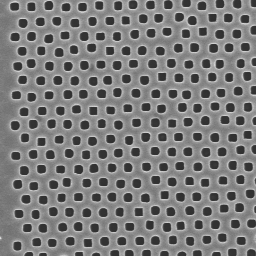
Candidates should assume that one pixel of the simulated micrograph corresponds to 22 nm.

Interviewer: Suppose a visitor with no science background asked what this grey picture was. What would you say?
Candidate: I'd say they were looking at a regular array of holes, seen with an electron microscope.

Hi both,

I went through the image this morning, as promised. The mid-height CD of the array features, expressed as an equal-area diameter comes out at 208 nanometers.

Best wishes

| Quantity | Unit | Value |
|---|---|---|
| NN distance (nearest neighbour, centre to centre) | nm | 340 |